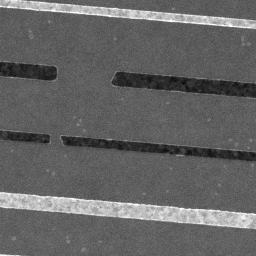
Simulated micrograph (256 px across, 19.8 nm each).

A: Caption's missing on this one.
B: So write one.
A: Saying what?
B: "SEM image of one or a few lines or trenches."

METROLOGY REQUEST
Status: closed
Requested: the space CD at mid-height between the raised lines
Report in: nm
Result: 1050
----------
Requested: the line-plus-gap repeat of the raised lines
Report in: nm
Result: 1290